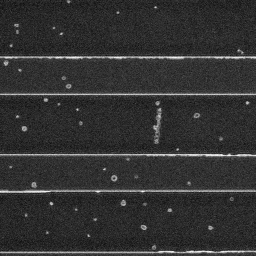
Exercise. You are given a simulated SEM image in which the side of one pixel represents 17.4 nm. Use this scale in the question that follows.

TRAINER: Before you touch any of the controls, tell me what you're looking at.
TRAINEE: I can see lines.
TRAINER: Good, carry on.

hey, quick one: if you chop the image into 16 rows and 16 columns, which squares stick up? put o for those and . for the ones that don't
................
................
................
................
oooooooooooooooo
oooooooooooooooo
................
................
................
................
oooooooooooooooo
oooooooooooooooo
................
................
................
................